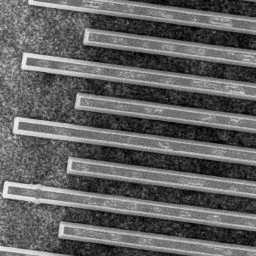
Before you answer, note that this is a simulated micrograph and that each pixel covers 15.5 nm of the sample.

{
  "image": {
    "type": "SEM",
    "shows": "parallel lines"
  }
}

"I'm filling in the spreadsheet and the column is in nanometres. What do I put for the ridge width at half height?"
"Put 182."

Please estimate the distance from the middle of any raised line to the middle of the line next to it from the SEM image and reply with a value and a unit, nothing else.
32.5 pixels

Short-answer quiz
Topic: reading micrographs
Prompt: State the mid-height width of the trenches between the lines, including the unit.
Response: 312 nm